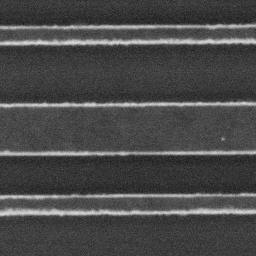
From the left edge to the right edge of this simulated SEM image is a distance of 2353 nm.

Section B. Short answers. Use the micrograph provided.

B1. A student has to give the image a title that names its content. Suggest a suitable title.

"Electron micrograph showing lines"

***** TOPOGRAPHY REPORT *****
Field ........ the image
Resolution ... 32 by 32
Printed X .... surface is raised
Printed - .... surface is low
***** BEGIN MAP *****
--------------------------------
--------------------------------
--------------------------------
XXXXXXXXXXXXXXXXXXXXXXXXXXXXXXXX
XXXXXXXXXXXXXXXXXXXXXXXXXXXXXXXX
XXXXXXXXX-X---------------------
--------------------------------
--------------------------------
--------------------------------
--------------------------------
--------------------------------
--------------------------------
--------------------------------
XXXXXXXXXXXXXXXXXXXXXXXXXXXXXXXX
XXXXXXXXXXXXXXXXXXXXXXXXXXXXXXXX
XXXXXXXXXXXXXXXXXXXXXXXXXXXXXXXX
XXXXXXXXXXXXXXXXXXXXXXXXXXXXXXXX
XXXXXXXXXXXXXXXXXXXXXXXXXXXXXXXX
XXXXXXXXXXXXXXXXXXXXXXXXXXXXXXXX
--------------------------------
--------------------------------
--------------------------------
--------------------------------
--------------------------------
---------X--XXXXXXXXXXXXXXXXXXXX
XXXXXXXXXXXXXXXXXXXXXXXXXXXXXXXX
XXXXXXXXXXXXXXXXXXXXXXXXXXXXXXXX
--------------------------------
--------------------------------
--------------------------------
--------------------------------
--------------------------------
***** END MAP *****